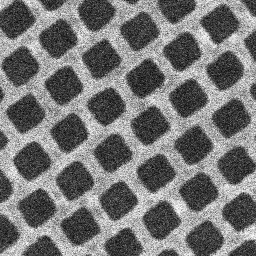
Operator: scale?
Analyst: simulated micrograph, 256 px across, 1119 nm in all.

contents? a regular array of holes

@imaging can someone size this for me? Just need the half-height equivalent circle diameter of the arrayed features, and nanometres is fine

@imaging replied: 164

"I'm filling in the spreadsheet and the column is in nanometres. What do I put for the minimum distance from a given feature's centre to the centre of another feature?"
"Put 203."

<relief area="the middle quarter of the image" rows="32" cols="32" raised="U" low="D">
DDUUUDDDDDDDDDUUUUDDDDDDUUUDDDDD
DDDUUUDDDDDDDUUUDDDDDDDDUUUDDDDU
DDDUUUUDDDDUUUUUDDDDDDDDDUUUUUUU
DDDDUUUDDDUUUUUDDDDDDDDDDUUUUUUD
DDDDDUUUUUUUUUUDDDDDDDDDDUUUUUDD
DDDDDUUUUUUUUUUUDDDDDDDDDUUUDDDD
DDDDDUUUUDDDDUUUUDDDDDDUUUUDDDDD
DDDDUUUUDDDDDDUUUDDDDDUUUUDDDDDD
DDDUUUDDDDDDDDDUUUDDUUUUUUDDDDDD
DDUUUUDDDDDDDDDUUUUUUUUUUUDDDDDD
UUUUUUDDDDDDDDDDUUUUUDDUUUUDDDDD
UUUUUUDDDDDDDDDDUUUUDDDDUUUUDDDD
UDDUUUUDDDDDDDDUUUUDDDDDDUUUDDDD
DDDDUUUDDDDDDDUUUDDDDDDDDDUUUDDU
DDDDDUUUDDDDDUUUDDDDDDDDDDUUUUUU
DDDDDDUUUDDUUUUUDDDDDDDDDDDUUUUU
DDDDDDUUUUUUUUUUUDDDDDDDDDDUUUDD
DDDDDDUUUUUUDDUUUDDDDDDDDDUUUDDD
DDDDDDUUUUDDDDDUUUDDDDDDUUUUDDDD
DDDDDUUUUDDDDDDDUUUDDDDUUUUDDDDD
DDDDUUUUDDDDDDDDUUUUDUUUUUUDDDDD
DDDUUUUDDDDDDDDDDUUUUUUUUUUUDDDD
UUUUUUUDDDDDDDDDDUUUUUUDDUUUUDDD
UUUUUUUUDDDDDDDDDUUUUDDDDDUUUDDD
UUDDDUUUDDDDDDDDUUUUDDDDDDUUUUDD
UDDDDUUUUDDDDDDUUUDDDDDDDDDUUUUD
DDDDDDUUUUDDDUUUUUDDDDDDDDDDUUUU
DDDDDDDUUUUUUUUUUUDDDDDDDDDDUUUU
DDDDDDDDUUUUUUUUUUDDDDDDDDDDUUUU
DDDDDDDDUUUUUDDDUUUDDDDDDDDUUUDD
DDDDDDDDUUUUDDDDUUUUDDDDDDUUUDDD
DDDDDDDUUUDDDDDDDUUUUDDDUUUUUDDD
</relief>